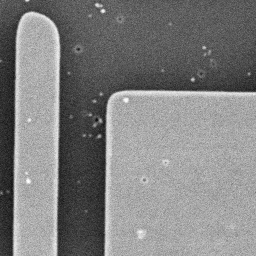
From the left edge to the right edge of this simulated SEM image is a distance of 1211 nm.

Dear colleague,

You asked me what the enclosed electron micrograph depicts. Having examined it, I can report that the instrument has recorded wiring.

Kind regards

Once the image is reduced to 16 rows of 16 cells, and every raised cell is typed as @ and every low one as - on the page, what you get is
----------------
-@@-------------
-@@@------------
-@@@------------
-@@@------------
-@@@------------
-@@@---@@@@@@@@@
-@@@---@@@@@@@@@
-@@@---@@@@@@@@@
-@@@---@@@@@@@@@
-@@@---@@@@@@@@@
-@@@---@@@@@@@@@
-@@@---@@@@@@@@@
-@@@---@@@@@@@@@
-@@@---@@@@@@@@@
-@@@---@@@@@@@@@